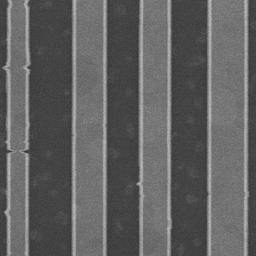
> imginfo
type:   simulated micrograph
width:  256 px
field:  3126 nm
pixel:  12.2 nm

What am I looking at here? one or a few lines or trenches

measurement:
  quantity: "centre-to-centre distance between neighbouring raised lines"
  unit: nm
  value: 856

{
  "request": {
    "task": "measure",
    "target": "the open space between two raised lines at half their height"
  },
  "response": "0.502 µm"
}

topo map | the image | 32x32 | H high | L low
LHHLLLLLLHHHHLLLLLHHHLLLLLHHHHHL
LHHLLLLLLHHHHLLLLLHHHLLLLLHHHHHL
LHHLLLLLLHHHHLLLLLHHHLLLLLHHHHHL
LHHLLLLLLHHHHLLLLLHHHLLLLLHHHHHL
LHHLLLLLLHHHHLLLLLHHHLLLLLHHHHHL
LHHLLLLLLHHHHLLLLLHHHLLLLLHHHHHL
LHHLLLLLLHHHHLLLLLHHHLLLLLHHHHHL
LHHLLLLLLHHHHLLLLLHHHLLLLLHHHHHL
LHHLLLLLLHHHHLLLLLHHHLLLLLHHHHHL
LHHLLLLLLHHHHLLLLLHHHLLLLLHHHHHL
LHHLLLLLLHHHHLLLLLHHHLLLLLHHHHHL
LHHLLLLLLHHHHLLLLLHHHLLLLLHHHHHL
LHHLLLLLLHHHHLLLLLHHHLLLLLHHHHHL
LHHLLLLLLHHHHLLLLLHHHLLLLLHHHHHL
LHHLLLLLLHHHHLLLLLHHHLLLLLHHHHHL
LHHLLLLLLHHHHLLLLLHHHLLLLLHHHHHL
LHHLLLLLLHHHHLLLLLHHHLLLLLHHHHHL
LHHLLLLLLHHHHLLLLLHHHLLLLLHHHHHL
LHHLLLLLLHHHHLLLLLHHHLLLLLHHHHHL
LHHLLLLLLHHHHLLLLLHHHLLLLLHHHHHL
LHHLLLLLLHHHHLLLLLHHHLLLLLHHHHHL
LHHLLLLLLHHHHLLLLLHHHLLLLLHHHHHL
LHHLLLLLLHHHHLLLLLHHHLLLLLHHHHHL
LHHLLLLLLHHHHLLLLLHHHLLLLLHHHHHL
LHHLLLLLLHHHHLLLLLHHHLLLLLHHHHHL
LHHLLLLLLHHHHLLLLLHHHLLLLLHHHHHL
LHHLLLLLLHHHHLLLLLHHHLLLLLHHHHHL
LHHLLLLLLHHHHLLLLLHHHLLLLLHHHHHL
LHHLLLLLLHHHHLLLLLHHHLLLLLHHHHHL
LHHLLLLLLHHHHLLLLLHHHLLLLLHHHHHL
LHHLLLLLLHHHHLLLLLHHHLLLLLHHHHHL
LHHLLLLLLHHHHLLLLLHHHLLLLLHHHHHL